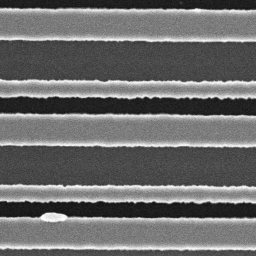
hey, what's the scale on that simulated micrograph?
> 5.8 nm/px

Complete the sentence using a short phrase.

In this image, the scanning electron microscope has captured lines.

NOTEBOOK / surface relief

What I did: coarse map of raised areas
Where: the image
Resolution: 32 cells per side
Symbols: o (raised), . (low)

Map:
................................
oooooooooooooooooooooooooooooooo
oooooooooooooooooooooooooooooooo
oooooooooooooooooooooooooooooooo
oooooooooooooooooooooooooooooooo
................................
................................
................................
................................
................................
oooooooooooooooooooooooooooooooo
oooooooooooooooooooooooooooooooo
................................
................................
ooooooooooooooooooooooooo..o..o.
oooooooooooooooooooooooooooooooo
oooooooooooooooooooooooooooooooo
oooooooooooooooooooooooooooooooo
................................
................................
................................
................................
................................
oooooooooooooooooooooooooooooooo
oooooooooooooooooooooooooooooooo
................................
................................
oooooooooooooooooooooooooooooooo
oooooooooooooooooooooooooooooooo
oooooooooooooooooooooooooooooooo
oooooooooooooooooooooooooooooooo
................................